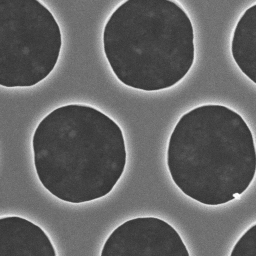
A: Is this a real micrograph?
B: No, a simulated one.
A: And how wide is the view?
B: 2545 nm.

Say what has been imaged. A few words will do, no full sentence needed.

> holes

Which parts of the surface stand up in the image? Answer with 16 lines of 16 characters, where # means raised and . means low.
...####....#####
....###.....###.
....##......###.
....###.....###.
...####.....###.
#########.######
################
###....####....#
##......###.....
##......##......
##......###.....
###....####.....
####..######..##
################
...####....####.
...###......###.